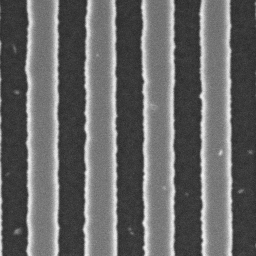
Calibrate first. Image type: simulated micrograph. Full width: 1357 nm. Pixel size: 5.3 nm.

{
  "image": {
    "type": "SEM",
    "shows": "lines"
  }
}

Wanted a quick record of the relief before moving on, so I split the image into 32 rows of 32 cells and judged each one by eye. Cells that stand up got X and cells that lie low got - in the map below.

---XXXX----XXX----XXXX---XXXX---
---XXXX----XXX----XXXX---XXXX---
----XXX----XXX----XXXX---XXXX---
----XXX----XXX----XXXX---XXXX---
---XXXX----XXX----XXXX---XXXX---
---XXXX----XXX----XXXX---XXXX---
---XXXX----XXX----XXXX---XXXX---
---XXXX----XXX----XXXX---XXXX---
---XXXX----XXX----XXXX---XXXX---
---XXXX----XXX----XXXX---XXXX---
---XXXX----XXX----XXXX---XXXX---
---XXXX----XXX----XXXX---XXXX---
---XXXX----XXX----XXXX---XXXX---
---XXXX----XXX----XXXX---XXXX---
---XXXX----XXX----XXXX---XXXX---
---XXXX----XXX----XXXX---XXXX---
---XXXX----XXXX---XXXX---XXXX---
---XXXX----XXX----XXXX---XXXX---
---XXXX----XXXX---XXXX---XXXX---
---XXXX----XXX----XXXX---XXXX---
---XXXX----XXXX---XXXX---XXXX---
---XXXX----XXXX---XXXX---XXXX---
---XXXX----XXXX---XXXX---XXXX---
---XXXX----XXXX---XXXX---XXXX---
----XXX----XXXX---XXXX---XXXX---
----XXX----XXXX---XXXX---XXXX---
---XXXX----XXXX---XXXX---XXXX---
---XXXX----XXXX---XXXX---XXXX---
---XXXX----XXXX---XXXX---XXXX---
----XXX----XXXX---XXXX---XXXX---
---XXXX----XXXX---XXXX---XXXX---
---XXXX----XXXX---XXXX---XXXX---